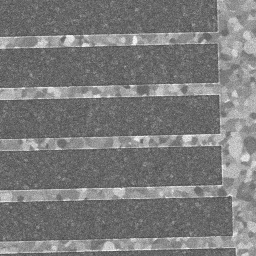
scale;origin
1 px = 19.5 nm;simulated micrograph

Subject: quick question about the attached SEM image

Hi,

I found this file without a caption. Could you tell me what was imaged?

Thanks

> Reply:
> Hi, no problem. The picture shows parallel lines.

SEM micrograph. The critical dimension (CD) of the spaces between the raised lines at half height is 0.783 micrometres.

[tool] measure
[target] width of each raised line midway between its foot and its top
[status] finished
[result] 0.215 µm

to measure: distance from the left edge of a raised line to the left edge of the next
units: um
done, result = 0.999